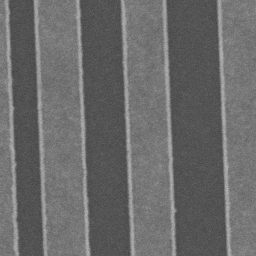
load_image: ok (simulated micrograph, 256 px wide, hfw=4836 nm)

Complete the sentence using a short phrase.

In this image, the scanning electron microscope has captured one or a few lines or trenches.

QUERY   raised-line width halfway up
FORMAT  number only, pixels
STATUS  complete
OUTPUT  40.7